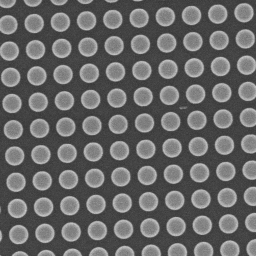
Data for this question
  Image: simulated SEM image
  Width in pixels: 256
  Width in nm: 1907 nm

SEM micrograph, an array of small figures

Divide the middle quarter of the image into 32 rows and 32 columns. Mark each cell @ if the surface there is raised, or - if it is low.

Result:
@----@@@---@@@@--@@@@@--@@@@--@@
@@--@@@@@--@@@@--@@@@@--@@@@--@@
@@--@@@@@--@@@@--@@@@@--@@@@---@
@@--@@@@---@@@@---@@@----@@-----
@----@@-------------------------
--------------------------------
------------@@----@@@---@@@@---@
@@---@@@@--@@@@---@@@@--@@@@@--@
@@--@@@@@--@@@@---@@@@--@@@@@--@
@@--@@@@@--@@@@---@@@@---@@@----
@@---@@@----@@@-----------------
--------------------------------
-------------------@@----@@@---@
@-----@@----@@@---@@@@--@@@@@--@
@@---@@@@--@@@@@--@@@@--@@@@@--@
@@@--@@@@--@@@@@--@@@@--@@@@@--@
@@@--@@@@---@@@----@@@---@@@----
@@----@@------------------------
--------------------------------
-------------@@----@@@---@@@@--@
@@---@@@@---@@@@--@@@@@--@@@@--@
@@@--@@@@@--@@@@--@@@@@--@@@@--@
@@@--@@@@@--@@@@--@@@@@--@@@@---
@@@---@@@---@@@----@@-----------
@@------------------------------
--------------------------@@@---
------@@@----@@@---@@@@--@@@@---
@@@--@@@@@--@@@@---@@@@--@@@@@--
@@@--@@@@@--@@@@---@@@@--@@@@@--
@@@---@@@@--@@@@---@@@----@@@---
@@@---@@@-----@-----------------
--------------------------------